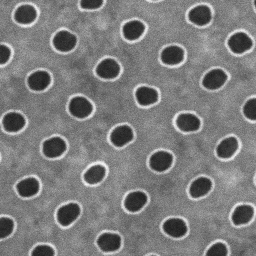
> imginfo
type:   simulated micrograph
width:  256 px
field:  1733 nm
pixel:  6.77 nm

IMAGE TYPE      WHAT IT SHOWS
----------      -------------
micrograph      a regular array of raised bodies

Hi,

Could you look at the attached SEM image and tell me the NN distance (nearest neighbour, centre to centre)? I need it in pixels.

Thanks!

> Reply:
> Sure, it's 47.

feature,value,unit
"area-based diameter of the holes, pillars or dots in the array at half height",174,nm